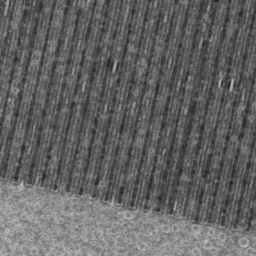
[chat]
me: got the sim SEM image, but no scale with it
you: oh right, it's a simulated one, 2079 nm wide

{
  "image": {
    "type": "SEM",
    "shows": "parallel lines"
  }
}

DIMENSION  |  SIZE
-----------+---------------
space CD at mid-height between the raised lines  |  57.5 nanometers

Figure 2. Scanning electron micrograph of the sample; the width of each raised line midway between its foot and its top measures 43.7 nanometers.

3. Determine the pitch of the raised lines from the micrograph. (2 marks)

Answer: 107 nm